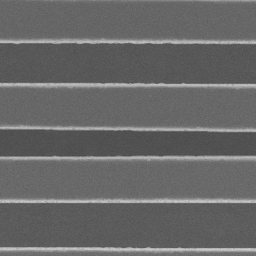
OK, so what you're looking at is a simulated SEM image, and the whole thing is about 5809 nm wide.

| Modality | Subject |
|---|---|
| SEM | lines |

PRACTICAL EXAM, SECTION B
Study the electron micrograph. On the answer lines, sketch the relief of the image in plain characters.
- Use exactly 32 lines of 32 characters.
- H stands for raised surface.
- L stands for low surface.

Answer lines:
HHHHHHHHHHHHHHHHHHHHHHHHHHHHHHHH
HHHHHHHHHHHHHHHHHHHHHHHHHHHHHHHH
HHHHHHHHHHHHHHHHHHHHHHHHHHHHHHHH
HHHHHHHHHHHHHHHHHHHHHHHHHHHHHHHH
HHHHHHHHHHHHHHHHHHHHHHHHHHHHHHHH
LLLLLLLLLLLLLLLLLLLLLLLLLLLLLLLL
LLLLLLLLLLLLLLLLLLLLLLLLLLLLLLLL
LLLLLLLLLLLLLLLLLLLLLLLLLLLLLLLL
LLLLLLLLLLLLLLLLLLLLLLLLLLLLLLLL
LLLLLLLLLLLLLLLLLLLLLLLLLLLLLLLL
HHHHHHHHHHHHHHLLLLLLLLLLLLLLLLLL
HHHHHHHHHHHHHHHHHHHHHHHHHHHHHHHH
HHHHHHHHHHHHHHHHHHHHHHHHHHHHHHHH
HHHHHHHHHHHHHHHHHHHHHHHHHHHHHHHH
HHHHHHHHHHHHHHHHHHHHHHHHHHHHHHHH
HHHHHHHHHHHHHHHHHHHHHHHHHHHHHHHH
LLLLLLLLLLLLLLLLLLLLLLLLLLLLLLLL
LLLLLLLLLLLLLLLLLLLLLLLLLLLLLLLL
LLLLLLLLLLLLLLLLLLLLLLLLLLLLLLLL
LLLLLLLLLLLLLLLLLLLLLLLLLLLLLLLL
HHHHHHHHHHHHHHHHHHHHHHHHHHHHHHHH
HHHHHHHHHHHHHHHHHHHHHHHHHHHHHHHH
HHHHHHHHHHHHHHHHHHHHHHHHHHHHHHHH
HHHHHHHHHHHHHHHHHHHHHHHHHHHHHHHH
HHHHHHHHHHHHHHHHHHHHHHHHHHHHHHHH
LLLLLLLLLLLLLLLLLLLLLLLLLLLLLLLL
LLLLLLLLLLLLLLLLLLLLLLLLLLLLLLLL
LLLLLLLLLLLLLLLLLLLLLLLLLLLLLLLL
LLLLLLLLLLLLLLLLLLLLLLLLLLLLLLLL
LLLLLLLLLLLLLLLLLLLLLLLLLLLLLLLL
LLLLLLLLLLLLLLLLLLLLLLLLLLLLLLLL
HHHHHHHHHHHHHHHHHHHHHHHHHHHHHHHH